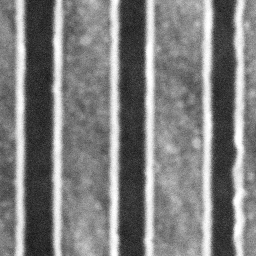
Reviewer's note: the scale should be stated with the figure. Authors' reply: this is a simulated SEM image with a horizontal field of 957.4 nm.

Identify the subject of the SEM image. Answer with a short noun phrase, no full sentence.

one or a few lines or trenches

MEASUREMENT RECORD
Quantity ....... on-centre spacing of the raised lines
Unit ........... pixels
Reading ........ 92.1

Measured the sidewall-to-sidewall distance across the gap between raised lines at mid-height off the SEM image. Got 210 nm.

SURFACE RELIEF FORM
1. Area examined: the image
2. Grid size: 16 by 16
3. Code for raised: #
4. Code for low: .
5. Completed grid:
.###...##....##.
.###...##....##.
.###...##....##.
.###...##....##.
.###...##....##.
.###...##....##.
.###...##....##.
.###...##....##.
.###...##....##.
.###...##....##.
.###...##....##.
.###...##....##.
.###...##....##.
.###...##....##.
.###...##....##.
.###...##....##.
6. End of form